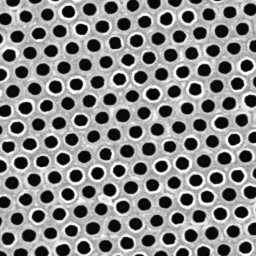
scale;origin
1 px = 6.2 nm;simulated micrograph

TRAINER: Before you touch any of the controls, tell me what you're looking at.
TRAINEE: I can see a regular array of holes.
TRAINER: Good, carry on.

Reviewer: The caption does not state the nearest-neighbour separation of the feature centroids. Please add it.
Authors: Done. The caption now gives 128 nanometres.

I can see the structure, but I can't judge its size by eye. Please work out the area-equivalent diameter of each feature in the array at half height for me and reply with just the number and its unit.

78.5 nm